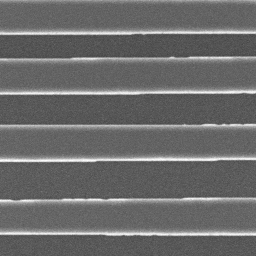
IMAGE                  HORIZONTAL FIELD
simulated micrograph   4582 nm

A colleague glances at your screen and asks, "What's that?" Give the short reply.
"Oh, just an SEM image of lines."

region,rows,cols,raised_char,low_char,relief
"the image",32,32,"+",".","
++++++++++++++++++++++++++++++++
++++++++++++++++++++++++++++++++
++++++++++++++++++++++++++++++++
++++++++++++++++++++++++++++++++
................................
................................
................................
++++++++++++++++++++++++++++++++
++++++++++++++++++++++++++++++++
++++++++++++++++++++++++++++++++
++++++++++++++++++++++++++++++++
+++++++++++++++++++++++++++++...
................................
................................
................................
................................
++++++++++++++++++++++++++++++++
++++++++++++++++++++++++++++++++
++++++++++++++++++++++++++++++++
++++++++++++++++++++++++++++++++
................................
................................
................................
................................
................................
++++++++++++++++++++++++++++++++
++++++++++++++++++++++++++++++++
++++++++++++++++++++++++++++++++
++++++++++++++++++++++++++++++++
................................
................................
................................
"